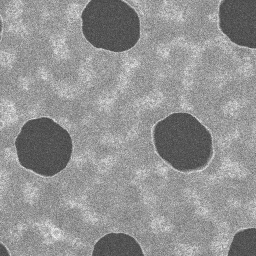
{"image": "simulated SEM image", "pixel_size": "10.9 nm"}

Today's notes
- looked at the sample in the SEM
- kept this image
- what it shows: holes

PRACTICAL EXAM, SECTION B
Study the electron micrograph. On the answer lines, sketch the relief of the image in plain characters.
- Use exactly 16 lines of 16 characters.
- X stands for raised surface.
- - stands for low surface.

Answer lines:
XXXXX---XXXXXX--
XXXXX----XXXXX--
XXXXX----XXXXX--
XXXXXXXXXXXXXXXX
XXXXXXXXXXXXXXXX
XXXXXXXXXXXXXXXX
XXXXXXXXXXXXXXXX
XX-XXXXXXX--XXXX
X---XXXXXX---XXX
X---XXXXXX---XXX
XX--XXXXXXX--XXX
XXXXXXXXXXXXXXXX
XXXXXXXXXXXXXXXX
XXXXXXXXXXXXXXXX
XXXXXXXXXXXXXXX-
XXXXXX---XXXXX--